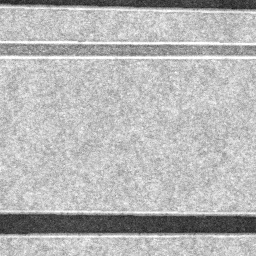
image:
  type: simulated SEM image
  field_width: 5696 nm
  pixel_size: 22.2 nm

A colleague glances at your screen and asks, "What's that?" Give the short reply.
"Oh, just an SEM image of lines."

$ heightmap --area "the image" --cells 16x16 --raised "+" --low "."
++++............
++++++++++++++++
++++++++++++++++
++++++++++++++++
++++++++++++++++
++++++++++++++++
++++++++++++++++
++++++++++++++++
++++++++++++++++
++++++++++++++++
++++++++++++++++
++++++++++++++++
++++++++++++++++
................
................
++++++++++++++++